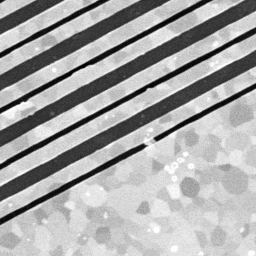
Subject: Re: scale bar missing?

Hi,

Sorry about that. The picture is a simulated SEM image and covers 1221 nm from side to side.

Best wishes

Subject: parallel lines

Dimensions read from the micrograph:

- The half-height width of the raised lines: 64.7 nanometers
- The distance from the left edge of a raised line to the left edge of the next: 119 nm